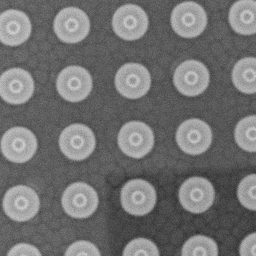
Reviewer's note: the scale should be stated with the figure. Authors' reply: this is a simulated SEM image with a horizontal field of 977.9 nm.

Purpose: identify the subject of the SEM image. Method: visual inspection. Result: an array of small figures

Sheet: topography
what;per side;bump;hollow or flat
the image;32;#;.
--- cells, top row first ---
.......................##....###
.##....###....####....####...###
####...####...####...#####...###
####...####...####....####...###
####...####....###.....##.......
.##.............................
................................
..............................##
........##.....###....####...###
####...####...#####...####...###
####...####...#####...####...###
####...####....###.....##.....##
.##.....##......................
................................
................................
................##.....###....##
.###....###....####...####...###
#####..#####...####...####...###
#####...####...####....###....##
.###....###.....##..............
................................
................................
.................#.....###....##
..##....####...####....####...##
.####...####...####...#####...##
#####...####...####....####...##
.####...####....###.....#.......
..#.............................
................................
...............................#
.........###....###....####...##
.####...####...#####...####...##